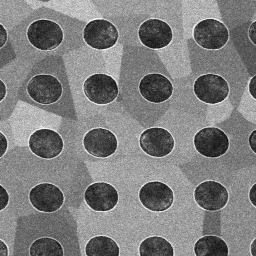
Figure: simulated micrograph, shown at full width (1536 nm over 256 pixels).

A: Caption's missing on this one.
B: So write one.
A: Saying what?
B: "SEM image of a regular array of holes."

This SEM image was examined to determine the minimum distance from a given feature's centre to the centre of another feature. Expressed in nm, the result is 325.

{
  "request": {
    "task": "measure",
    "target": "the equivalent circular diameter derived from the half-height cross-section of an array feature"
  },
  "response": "0.193 microns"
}